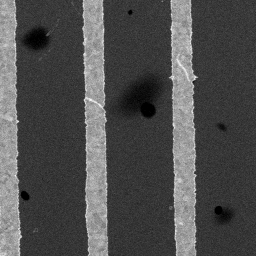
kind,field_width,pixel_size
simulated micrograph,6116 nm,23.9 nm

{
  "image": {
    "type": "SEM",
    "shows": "one or a few lines or trenches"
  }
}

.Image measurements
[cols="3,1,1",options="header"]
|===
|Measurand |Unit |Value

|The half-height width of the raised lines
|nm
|469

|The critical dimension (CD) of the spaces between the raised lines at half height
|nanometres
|1640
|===